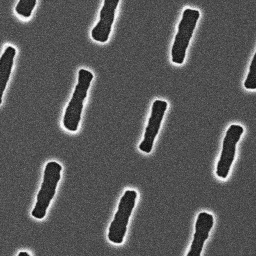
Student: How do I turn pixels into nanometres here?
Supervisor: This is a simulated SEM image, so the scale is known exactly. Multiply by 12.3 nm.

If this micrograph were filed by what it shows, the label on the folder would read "holes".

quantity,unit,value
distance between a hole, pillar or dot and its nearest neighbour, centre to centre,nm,980